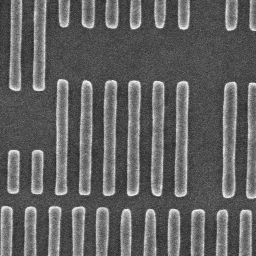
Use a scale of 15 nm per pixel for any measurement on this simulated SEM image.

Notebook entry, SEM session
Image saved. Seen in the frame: wiring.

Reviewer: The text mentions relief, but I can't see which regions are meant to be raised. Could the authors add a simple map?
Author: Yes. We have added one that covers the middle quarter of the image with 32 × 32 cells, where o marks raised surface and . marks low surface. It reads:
................................
................................
................................
................................
o....o.....oo....oo....o.....oo.
o...ooo...ooo...ooo...ooo...ooo.
o...ooo...ooo...ooo...ooo...ooo.
o...ooo...ooo...ooo...ooo...ooo.
o...ooo...ooo...ooo...ooo...ooo.
o...ooo...ooo...ooo...ooo...ooo.
o...ooo...ooo...ooo...ooo...ooo.
o...ooo...ooo...ooo...ooo...ooo.
o...ooo...ooo...ooo...ooo...ooo.
o...ooo...ooo...ooo...ooo...ooo.
o...ooo...ooo...ooo...ooo...ooo.
o...ooo...ooo...ooo...ooo...ooo.
o...ooo...ooo...ooo...ooo...ooo.
o...ooo...ooo...ooo...ooo...ooo.
o...ooo...ooo...ooo...ooo...ooo.
o...ooo...ooo...ooo...ooo...ooo.
o...ooo...ooo...ooo...ooo...ooo.
o...ooo...ooo...ooo...ooo...ooo.
o...ooo...ooo...ooo...ooo...ooo.
o...ooo...ooo...ooo...ooo...ooo.
o...ooo...ooo...ooo...ooo...ooo.
....ooo...ooo...ooo...ooo...ooo.
....ooo...ooo...ooo...ooo...ooo.
....ooo...ooo...ooo...ooo...ooo.
....ooo...ooo...ooo...ooo...ooo.
....ooo...ooo...ooo...ooo...ooo.
o...ooo...ooo...ooo...ooo...ooo.
o...ooo...ooo...oo....oo....ooo.